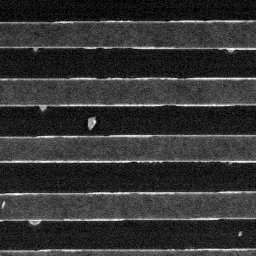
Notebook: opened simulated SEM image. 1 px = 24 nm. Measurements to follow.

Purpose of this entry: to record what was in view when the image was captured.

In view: lines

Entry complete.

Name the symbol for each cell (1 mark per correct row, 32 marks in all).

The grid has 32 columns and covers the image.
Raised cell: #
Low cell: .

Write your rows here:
................................
................................
................................
################################
################################
################################
................................
................................
................................
................................
################################
################################
################################
................................
................................
................................
................................
################################
################################
################################
................................
................................
................................
................................
################################
################################
################################
#...............................
................................
................................
................................
################################